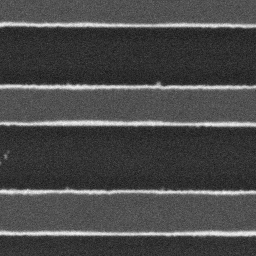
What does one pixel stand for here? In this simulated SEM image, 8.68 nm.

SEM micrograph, lines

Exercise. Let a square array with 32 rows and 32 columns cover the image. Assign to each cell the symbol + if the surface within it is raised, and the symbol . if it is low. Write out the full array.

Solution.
++++++++++++++++++++++++++++++++
++++++++++++++++++++++++++++++++
++++++++++++++++++++++++++++++++
................................
................................
................................
................................
................................
................................
................................
................................
++++++++++++++++++++++++++++++++
++++++++++++++++++++++++++++++++
++++++++++++++++++++++++++++++++
++++++++++++++++++++++++++++++++
++++++++++++++++++++++++++++++++
................................
................................
................................
................................
................................
................................
................................
................................
++++++++++++++++++++++++++++++++
++++++++++++++++++++++++++++++++
++++++++++++++++++++++++++++++++
++++++++++++++++++++++++++++++++
++++++++++++++++++++++++++++++++
................................
................................
................................